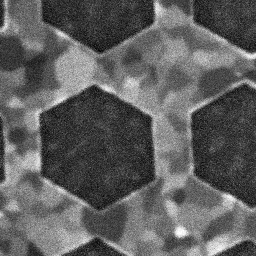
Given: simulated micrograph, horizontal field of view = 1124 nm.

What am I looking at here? holes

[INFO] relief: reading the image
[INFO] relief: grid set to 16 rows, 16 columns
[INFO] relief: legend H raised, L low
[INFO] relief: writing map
HHHLLLLLLLHHLLLL
HHHLLLLLLHHHLLLL
HHHHHLLLHHHHHHLL
HHHHHHHHHHHHHHHH
HHHHHHHHHHHHHHHH
HHHHHLHHHHHHHHLL
HHHHLLLLHHHHHLLL
HHLLLLLLLHHHLLLL
HHLLLLLLLLHHLLLL
HHLLLLLLLLHHLLLL
HHLLLLLLLLHHLLLL
HHHLLLLLLHHHHLLL
HHHHHLLLHHHHHHHL
HHHHHHHHHHHHHHHH
HHHHHHHHHHHHHHHH
HHHHHLLHHHHHHHLL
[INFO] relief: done